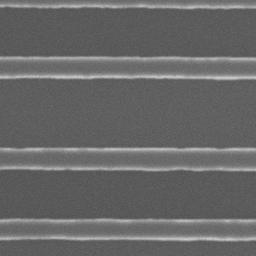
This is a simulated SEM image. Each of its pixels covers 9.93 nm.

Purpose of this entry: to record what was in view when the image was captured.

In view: lines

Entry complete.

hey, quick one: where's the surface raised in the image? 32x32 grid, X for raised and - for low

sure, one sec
XXXXXXXXXXXXXXXXXXXXXXXXXXXXXXXX
--------------------------------
--------------------------------
--------------------------------
--------------------------------
--------------------------------
--------------------------------
XXXXXXXXXXXXXXXXXXXXXXXXXXXXXXXX
XXXXXXXXXXXXXXXXXXXXXXXXXXXXXXXX
XXXXXXXXXXXXXXXXXXXXXXXXXXXXXXXX
--------------------------------
--------------------------------
--------------------------------
--------------------------------
--------------------------------
--------------------------------
--------------------------------
--------------------------------
--------------------------------
XXXXXXXXXXXXXXXXXXXXXXXXXXXXXXXX
XXXXXXXXXXXXXXXXXXXXXXXXXXXXXXXX
--------------------------------
--------------------------------
--------------------------------
--------------------------------
--------------------------------
--------------------------------
--------------------------------
XXXXXXXXXXXXXXXXXXXXXXXXXXXXXXXX
XXXXXXXXXXXXXXXXXXXXXXXXXXXXXXXX
--------------------------------
--------------------------------